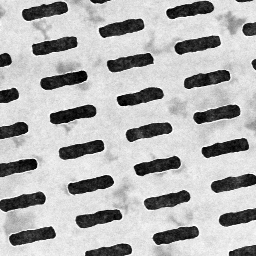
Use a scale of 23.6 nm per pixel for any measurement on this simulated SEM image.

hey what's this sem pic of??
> a regular array of holes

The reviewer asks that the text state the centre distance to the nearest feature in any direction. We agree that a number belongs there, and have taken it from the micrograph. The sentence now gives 35.5 px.